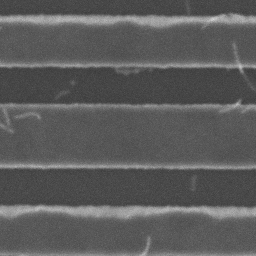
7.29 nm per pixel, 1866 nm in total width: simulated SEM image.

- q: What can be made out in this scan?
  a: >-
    lines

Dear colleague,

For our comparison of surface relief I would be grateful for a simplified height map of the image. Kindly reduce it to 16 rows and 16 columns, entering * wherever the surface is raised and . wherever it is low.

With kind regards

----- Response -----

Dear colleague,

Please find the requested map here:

................
****************
****************
****************
................
................
*....*........*.
****************
****************
****************
..*....*.*******
................
................
****************
****************
****************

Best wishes